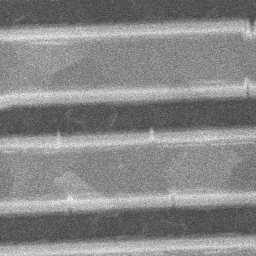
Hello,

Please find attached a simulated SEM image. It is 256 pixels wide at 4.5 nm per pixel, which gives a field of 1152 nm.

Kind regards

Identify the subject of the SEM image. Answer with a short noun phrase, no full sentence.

one or a few lines or trenches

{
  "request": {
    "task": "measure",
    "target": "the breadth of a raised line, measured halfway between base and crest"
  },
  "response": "299 nanometres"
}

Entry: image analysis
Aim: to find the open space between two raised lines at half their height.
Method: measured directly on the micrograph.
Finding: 0.189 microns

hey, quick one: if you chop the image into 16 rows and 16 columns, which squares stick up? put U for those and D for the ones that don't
DDDDDDDDDDDDDDDD
DDDDDDDDDDDDDDDD
UUUUUUUUUUUUUUUU
UUUUUUUUUUUUUUUU
UUUUUUUUUUUUUUUU
UUUUUUUUUUUUUUUU
DDDDDDDDDDDDDDDD
DDDDDDDDDDDDDDDD
DDDDDDDDDDDUUUUU
UUUUUUUUUUUUUUUU
UUUUUUUUUUUUUUUU
UUUUUUUUUUUUUUUU
UUUUUUUUUUUUUDDD
DDDDDDDDDDDDDDDD
DDDDDDDDDDDDDDDD
DDDDDUUUUUUUUUUU